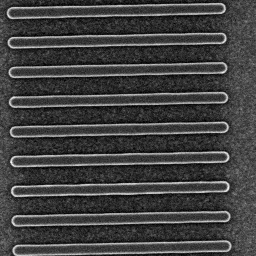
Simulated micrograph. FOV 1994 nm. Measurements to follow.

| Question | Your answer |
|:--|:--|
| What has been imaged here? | groups of lines, slits or small figures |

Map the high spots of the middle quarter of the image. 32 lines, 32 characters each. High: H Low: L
LLLLLHHHHHHHHHHHHHHHHHHHHHHHHHHH
HHHHHHHHHHHHHHHHHHHHHHHHHHHHHHHH
HHHHHHHHHHHHHHHHHHHHLLLLLLLLLLLL
LLLLLLLLLLLLLLLLLLLLLLLLLLLLLLLL
LLLLLLLLLLLLLLLLLLLLLLLLLLLLLLLL
LLLLLLLLLLLLLLLLLLLLLLLLLLLLLLLL
LLLLLLLLLLLLLLLLLLLLLLLLLLLLLLLL
LLLLLLLLLLLLLLLLLLLLLLLLHHHLLHHH
HHHHHHHHHHHHHHHHHHHHHHHHHHHHHHHH
HHHHHHHHHHHHHHHHHHHHHHHHHHHHHHHH
LLLLLLLLLLLLLLLLLLLLLLLLLLLLLLLL
LLLLLLLLLLLLLLLLLLLLLLLLLLLLLLLL
LLLLLLLLLLLLLLLLLLLLLLLLLLLLLLLL
LLLLLLLLLLLLLLLLLLLLLLLLLLLLLLLL
LLLLLLLLLLLLLLLLLLLLLLLLLLLLLLLL
HHHHHHHHHHHHHHHHHHHHHHHHHHHHHHHH
HHHHHHHHHHHHHHHHHHHHHHHHHHHHHHHH
HHHHHHHHHHHHHHHHHHHHLLLLLLLLLLLL
LLLLLLLLLLLLLLLLLLLLLLLLLLLLLLLL
LLLLLLLLLLLLLLLLLLLLLLLLLLLLLLLL
LLLLLLLLLLLLLLLLLLLLLLLLLLLLLLLL
LLLLLLLLLLLLLLLLLLLLLLLLLLLLLLLL
LLLLLLLLLLLLLLHHHHHHHHHHHHHHHHHH
HHHHHHHHHHHHHHHHHHHHHHHHHHHHHHHH
HHHHHHHHHHHHHHHHHHHHHHHHHHHHHHHH
LLLLLLLLLLLLLLLLLLLLLLLLLLLLLLLL
LLLLLLLLLLLLLLLLLLLLLLLLLLLLLLLL
LLLLLLLLLLLLLLLLLLLLLLLLLLLLLLLL
LLLLLLLLLLLLLLLLLLLLLLLLLLLLLLLL
LLLLLLLLLLLLLLLLLLLLLLLLLLLLLLLL
HHHHHHHHHHHHHHHHHHHHHHHHHHHHHHHH
HHHHHHHHHHHHHHHHHHHHHHHHHHHHHHHH